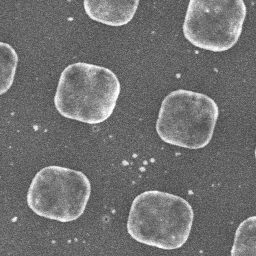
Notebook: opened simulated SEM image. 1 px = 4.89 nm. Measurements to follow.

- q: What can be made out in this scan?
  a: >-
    raised bodies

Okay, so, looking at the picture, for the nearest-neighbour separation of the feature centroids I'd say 0.506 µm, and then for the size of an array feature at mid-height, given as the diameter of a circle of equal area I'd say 0.295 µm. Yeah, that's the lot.